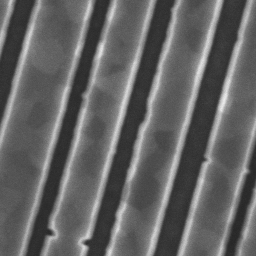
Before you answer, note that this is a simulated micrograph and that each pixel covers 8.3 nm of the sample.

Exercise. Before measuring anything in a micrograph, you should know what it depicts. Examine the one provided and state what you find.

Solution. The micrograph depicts one or a few lines or trenches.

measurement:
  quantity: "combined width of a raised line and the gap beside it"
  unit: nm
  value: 542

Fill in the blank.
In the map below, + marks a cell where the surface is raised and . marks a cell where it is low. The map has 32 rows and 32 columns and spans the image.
+....+++++++..+++++...+++++....+
+...+++++++...+++++...+++++....+
+...+++++++..++++++...+++++....+
+...+++++++..+++++...++++++...++
...+++++++...+++++...+++++....++
...+++++++...+++++...+++++....++
...+++++++..+++++...++++++...+++
...+++++++..+++++...++++++...+++
..+++++++...+++++...+++++....+++
..+++++++...+++++...+++++....+++
..+++++++..+++++...++++++...++++
..++++++...+++++...+++++....++++
.+++++++...+++++...+++++....++++
.+++++++..++++++...+++++....++++
.+++++++..+++++....+++++...+++++
+++++++...+++++...+++++....+++++
+++++++...+++++...+++++....+++++
+++++++..+++++...++++++...++++++
+++++++..+++++...+++++....+++++.
++++++...+++++...+++++....+++++.
++++++..++++++...+++++....+++++.
++++++..+++++...++++++...++++++.
+++++...+++++...+++++....+++++..
+++++...+++++...+++++....+++++..
+++++...+++++...+++++....+++++..
+++++..+++++...++++++...+++++...
++++...+++++...+++++....+++++..+
++++..++++++...+++++....+++++..+
++++..+++++...++++++...++++++..+
++++..+++++...+++++....+++++..++
+++...++++....+++++....+++++..++
+++..++++++...+++++....+++++..++